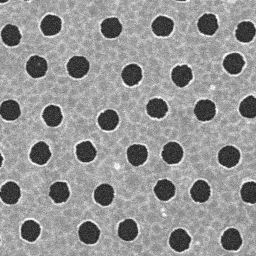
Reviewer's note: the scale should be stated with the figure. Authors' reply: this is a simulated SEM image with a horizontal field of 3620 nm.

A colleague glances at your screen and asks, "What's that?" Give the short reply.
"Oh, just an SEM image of a regular array of holes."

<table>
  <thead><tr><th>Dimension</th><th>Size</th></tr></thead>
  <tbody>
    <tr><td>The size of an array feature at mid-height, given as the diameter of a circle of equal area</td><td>316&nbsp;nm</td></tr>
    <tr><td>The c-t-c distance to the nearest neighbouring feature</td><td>584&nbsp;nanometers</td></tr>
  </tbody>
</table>